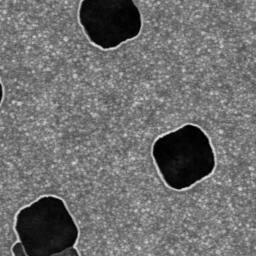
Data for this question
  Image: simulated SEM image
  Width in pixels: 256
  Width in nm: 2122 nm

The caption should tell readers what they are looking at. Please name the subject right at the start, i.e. holes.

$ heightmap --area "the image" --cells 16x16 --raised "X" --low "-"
XXXXX----XXXXXXX
XXXXX----XXXXXXX
XXXXXX--XXXXXXXX
XXXXXXXXXXXXXXXX
XXXXXXXXXXXXXXXX
XXXXXXXXXXXXXXXX
XXXXXXXXXXXXXXXX
XXXXXXXXXXXXXXXX
XXXXXXXXXX---XXX
XXXXXXXXXX---XXX
XXXXXXXXXX---XXX
XXXXXXXXXXX-XXXX
XX--XXXXXXXXXXXX
X---XXXXXXXXXXXX
X----XXXXXXXXXXX
X----XXXXXXXXXXX